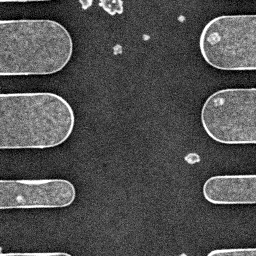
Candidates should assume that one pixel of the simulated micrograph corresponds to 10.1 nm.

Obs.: groups of lines, slits or small figures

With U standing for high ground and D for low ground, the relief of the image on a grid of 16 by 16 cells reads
DDDDDDDDDDDDDDDD
UUUUDDDDDDDDDUUU
UUUUDDDDDDDDDUUU
UUUUDDDDDDDDDUUU
UUUDDDDDDDDDDDDD
DDDDDDDDDDDDDDDD
UUUUDDDDDDDDDUUU
UUUUUDDDDDDDDUUU
UUUUDDDDDDDDDUUU
DDDDDDDDDDDDDDDD
DDDDDDDDDDDDDDDD
UUUUDDDDDDDDDUUU
UUUUDDDDDDDDDUUU
DDDDDDDDDDDDDDDD
DDDDDDDDDDDDDDDD
DDDDDDDDDDDDDDDD